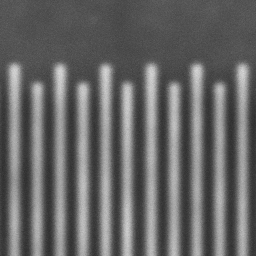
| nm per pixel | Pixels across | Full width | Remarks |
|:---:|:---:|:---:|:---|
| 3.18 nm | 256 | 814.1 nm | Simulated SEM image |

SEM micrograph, parallel lines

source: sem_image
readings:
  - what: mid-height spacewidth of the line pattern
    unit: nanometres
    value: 44.6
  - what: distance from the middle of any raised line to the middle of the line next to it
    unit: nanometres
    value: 72.6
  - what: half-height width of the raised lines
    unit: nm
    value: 27.9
